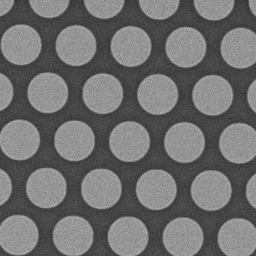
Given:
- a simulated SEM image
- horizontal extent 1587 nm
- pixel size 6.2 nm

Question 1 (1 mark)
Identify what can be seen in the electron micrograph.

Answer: an array of small figures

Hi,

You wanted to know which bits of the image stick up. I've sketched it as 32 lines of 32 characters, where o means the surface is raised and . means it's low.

oo..ooooo..oooo..ooooo..ooooo..o
o...oooo...oooo...oooo...oooo...
................................
.ooo....ooo....oo......o........
ooooo..ooooo..ooooo..oooo...oooo
ooooo..ooooo..ooooo..ooooo..oooo
ooooo..ooooo..ooooo..ooooo..oooo
.ooo....ooo....ooo...oooo...oooo
................................
o....oo.....oo.....oo.....o.....
o...oooo...oooo...oooo...oooo..o
oo..oooo..ooooo..ooooo..ooooo..o
o...oooo..ooooo..ooooo..ooooo..o
o...oooo...oooo...oooo...oooo..o
................................
.ooo....ooo....oo.....oo.....o..
ooooo..ooooo..oooo...oooo...oooo
ooooo..ooooo..ooooo..ooooo.ooooo
ooooo..ooooo..ooooo..oooo..ooooo
.ooo....ooo...oooo...oooo...oooo
................................
o...ooo....ooo....ooo....oo.....
o...oooo..ooooo..ooooo..ooooo..o
o..ooooo..ooooo..ooooo..ooooo..o
o...oooo..ooooo..ooooo..ooooo..o
....ooo....ooo....ooo....ooo...o
................................
.ooo....ooo....oo.....oo.....oo.
ooooo..oooo...oooo...oooo...oooo
ooooo..ooooo..oooo..ooooo..ooooo
ooooo..oooo...oooo..ooooo..ooooo
.ooo....ooo...oooo...oooo...oooo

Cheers